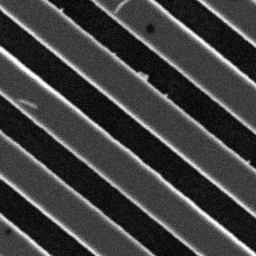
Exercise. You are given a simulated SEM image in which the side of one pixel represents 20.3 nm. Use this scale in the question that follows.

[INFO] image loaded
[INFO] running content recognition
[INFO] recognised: lines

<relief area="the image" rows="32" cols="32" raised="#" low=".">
######......########.....#######
########.....########......#####
..#######.....########......####
...#######......#######......###
....#######......########.....##
.....########.....########......
#......#######.....########.....
##......#######......#######....
###......#######......#######...
#####.....########.....########.
######.....########.....########
#######......#######......######
.#######......#######......#####
..#######......#######......####
...########.....########.....###
.....#######......#######.....##
......#######......#######......
#......#######......#######.....
###.....########.....#######....
####......#######.....########..
#####......#######......#######.
######......#######......#######
########.....########.....######
..#######.....########.....#####
...#######......#######......###
....#######......#######......##
.....########.....#######......#
#.....########.....########.....
##......#######......#######....
###......#######......#######...
#####.....########.....#######..
######......#######.....########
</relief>